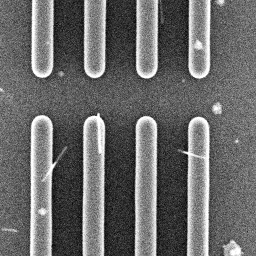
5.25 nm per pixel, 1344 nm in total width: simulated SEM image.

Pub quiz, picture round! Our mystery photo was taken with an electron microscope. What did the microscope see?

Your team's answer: groups of lines, slits or small figures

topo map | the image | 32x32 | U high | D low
DDDDUUUDDDDUUDDDDUUUDDDDUUDDDDDD
DDDDUUUDDDDUUDDDDUUUDDDDUUDDDDDD
DDDDUUUDDDDUUDDDDUUUDDDDUUDDDDDD
DDDDUUUDDDDUUDDDDUUUDDDDUUDDDDDD
DDDDUUUDDDDUUDDDDUUUDDDDUUDDDDDD
DDDDUUUDDDDUUDDDDUUUDDDDUUDDDDDD
DDDDUUUDDDDUUDDDDUUUDDDDUUDDDDDD
DDDDUUUDDDDUUDDDDUUUDDDDUUDDDDDD
DDDDUUUDDDDUUDDDDUUUDDDDUUDDDDDD
DDDDDUDDDDDUDDDDDDUDDDDDUUDDDDDD
DDDDDDDDDDDDDDDDDDDDDDDDDDDDDDDD
DDDDDDDDDDDDDDDDDDDDDDDDDDDDDDDD
DDDDDDDDDDDDDDDDDDDDDDDDDDDDDDDD
DDDDDDDDDDDDDDDDDDDDDDDDDDDDDDDD
DDDDDDDDDDDDDDDDDDDDDDDDDDDDDDDD
DDDDUUDDDDDUUDDDDUUDDDDDUUDDDDDD
DDDDUUDDDDDUUDDDDUUUDDDDUUDDDDDD
DDDDUUDDDDDUUDDDDUUUDDDDUUDDDDDD
DDDDUUDDDDDUUDDDDUUDDDDDUUDDDDDD
DDDDUUDDDDDUUDDDDUUDDDDUUUDDDDDD
DDDDUUUDDDDUUDDDDUUDDDDDUUDDDDDD
DDDDUUDDDDDUUDDDDUUDDDDDUUDDDDDD
DDDDUUDDDDDUUDDDDUUDDDDDUUDDDDDD
DDDDUUDDDDDUUDDDDUUDDDDDUUDDDDDD
DDDDUUDDDDUUUDDDDUUDDDDDUUDDDDDD
DDDDUUDDDDUUUDDDDUUDDDDDUUDDDDDD
DDDDUUDDDDUUUDDDDUUDDDDDUUDDDDDD
DDDDUUDDDDUUUDDDDUUDDDDDUUDDDDDD
DDDDUUDDDDUUUDDDDUUDDDDDUUDDDDDD
DDDDUUDDDDUUUDDDDUUDDDDDUUDDDDDD
DDDDUUDDDDUUUDDDDUUDDDDDUUDDDDDD
DDDDUUDDDDUUUDDDDUUDDDDUUUDDDDDD